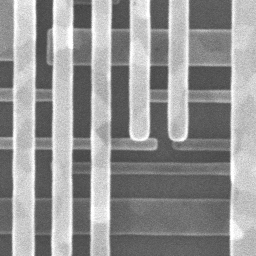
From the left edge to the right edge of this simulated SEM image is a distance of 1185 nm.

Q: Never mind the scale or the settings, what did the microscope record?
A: wiring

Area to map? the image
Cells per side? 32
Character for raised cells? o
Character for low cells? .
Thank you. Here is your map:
..oo...oo...oo..ooo..oo......ooo
..oo...oo...oo..ooo..oo......ooo
..oo...oo...oo..ooo..oo......ooo
..oo...oo...oo..ooo..oo......ooo
..oo...oo...oo..ooo..oo......ooo
..oo...oo...oo..ooo..oo......ooo
..oo...oo...oo..ooo..oo......ooo
..oo...oo..ooo..ooo..oo......ooo
..oo...oo..ooo..ooo..oo......ooo
..oo...oo..ooo..ooo..oo......ooo
..oo...oo..ooo..ooo..oo......ooo
..oo...oo..ooo..ooo..oo......ooo
..oo...oo..ooo..ooo..oo......ooo
..oo...oo..ooo..ooo..oo......ooo
..oo...oo..ooo..ooo..oo......ooo
..oo...oo..ooo..ooo..oo......ooo
..oo...oo..ooo..ooo..oo......ooo
..oo...oo..ooo...o....o......ooo
..oo...oo..ooo...............ooo
..oo...oo..ooo...............ooo
..oo...oo..ooo...............ooo
..oo...oo..ooo...............ooo
..oo...oo..ooo...............ooo
..oo...oo..ooo...............ooo
..oo...oo..ooo...............ooo
..oo...oo..ooo...............ooo
..oo...oo..ooo...............ooo
..oo...oo..ooo...............ooo
..oo...oo..ooo...............ooo
..oo...oo..ooo...............ooo
..oo...oo..ooo...............ooo
..oo...oo..ooo...............ooo